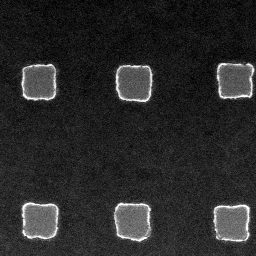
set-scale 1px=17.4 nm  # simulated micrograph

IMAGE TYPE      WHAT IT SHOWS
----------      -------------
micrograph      raised bodies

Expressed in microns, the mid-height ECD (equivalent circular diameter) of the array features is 0.645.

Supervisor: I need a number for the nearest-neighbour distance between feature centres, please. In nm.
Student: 1650